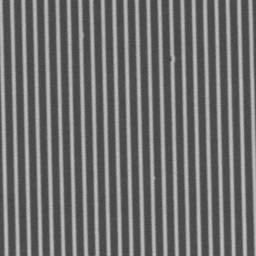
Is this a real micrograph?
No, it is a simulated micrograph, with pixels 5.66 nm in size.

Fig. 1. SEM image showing parallel lines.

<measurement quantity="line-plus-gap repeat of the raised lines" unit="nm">64.3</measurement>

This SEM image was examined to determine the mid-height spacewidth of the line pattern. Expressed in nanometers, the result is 43.2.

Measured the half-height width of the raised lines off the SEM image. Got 19.1 nanometers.